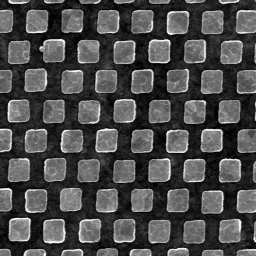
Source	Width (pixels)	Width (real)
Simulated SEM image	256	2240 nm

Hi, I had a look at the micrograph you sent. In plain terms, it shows a regular array of raised bodies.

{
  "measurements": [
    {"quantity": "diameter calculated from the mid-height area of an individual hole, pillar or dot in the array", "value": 0.211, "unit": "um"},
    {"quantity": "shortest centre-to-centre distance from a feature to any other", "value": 297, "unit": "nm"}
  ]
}